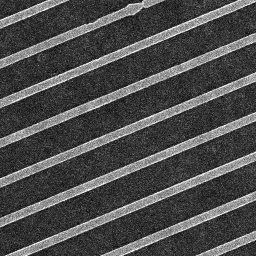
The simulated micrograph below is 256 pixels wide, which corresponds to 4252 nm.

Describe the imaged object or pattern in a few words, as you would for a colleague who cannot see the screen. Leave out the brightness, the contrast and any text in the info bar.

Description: parallel lines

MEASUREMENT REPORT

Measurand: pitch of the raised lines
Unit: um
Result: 0.609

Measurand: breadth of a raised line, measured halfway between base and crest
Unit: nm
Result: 130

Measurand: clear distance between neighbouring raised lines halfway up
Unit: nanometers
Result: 474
